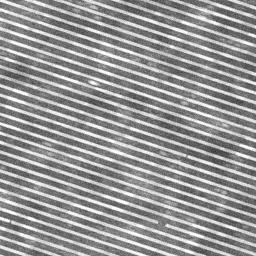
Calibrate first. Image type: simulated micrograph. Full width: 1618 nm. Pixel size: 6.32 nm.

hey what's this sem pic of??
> parallel lines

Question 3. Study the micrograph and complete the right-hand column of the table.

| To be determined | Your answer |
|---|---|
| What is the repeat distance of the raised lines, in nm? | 56.9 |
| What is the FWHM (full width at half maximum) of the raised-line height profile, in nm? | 15.8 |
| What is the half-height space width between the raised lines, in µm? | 0.0435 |